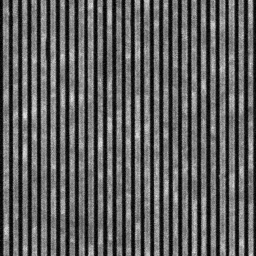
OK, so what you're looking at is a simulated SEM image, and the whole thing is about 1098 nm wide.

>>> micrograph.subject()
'parallel lines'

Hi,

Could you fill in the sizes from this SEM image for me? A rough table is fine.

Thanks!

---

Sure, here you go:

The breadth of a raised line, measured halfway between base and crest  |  4.99 pixels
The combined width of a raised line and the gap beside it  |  0.0403 microns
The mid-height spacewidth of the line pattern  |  21.4 nm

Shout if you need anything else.